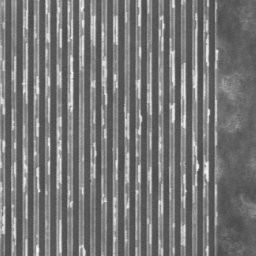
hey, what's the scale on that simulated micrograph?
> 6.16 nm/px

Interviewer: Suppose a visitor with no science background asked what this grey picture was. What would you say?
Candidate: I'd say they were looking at parallel lines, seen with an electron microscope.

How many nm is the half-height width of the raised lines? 27.7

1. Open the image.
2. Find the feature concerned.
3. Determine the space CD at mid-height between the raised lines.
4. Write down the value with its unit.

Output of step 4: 38.5 nm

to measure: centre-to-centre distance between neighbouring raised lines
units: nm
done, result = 69.7